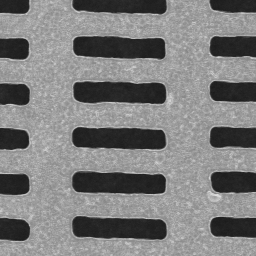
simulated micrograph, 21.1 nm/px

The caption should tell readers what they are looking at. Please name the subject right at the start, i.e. holes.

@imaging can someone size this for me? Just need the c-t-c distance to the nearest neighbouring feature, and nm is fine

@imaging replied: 948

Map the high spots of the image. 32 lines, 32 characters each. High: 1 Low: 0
00001111100000000000011111000000
00011111111000000000011111110000
11111111111111111111111111111111
11111111111111111111111111111111
11111111111111111111111111111111
00001111100000000000011111000000
00001111100000000000011111000000
11111111111111111111111111111111
11111111111111111111111111111111
11111111111111111111111111111111
00011111100000000000111111000000
00001111100000000000011111000000
00001111110000000000011111100000
11111111111111111111111111111111
11111111111111111111111111111111
11111111111111111111111111111111
00011111100000000000111111000000
00001111100000000000011111000000
00011111111000000000111111111100
11111111111111111111111111111111
11111111111111111111111111111111
11111111110011111111111111100000
00001111100000000000011111000000
00001111100000000000011111100000
11111111111111111111111111111111
11111111111111111111111111111111
11111111111111111111111111111111
00011111100000000000111111100000
00001111100000000000011111000000
00001111110000000000011111100000
11111111111111111111111111111111
11111111111111111111111111111111